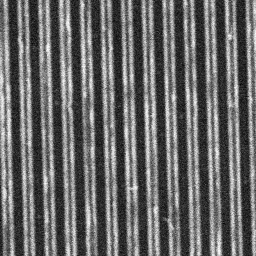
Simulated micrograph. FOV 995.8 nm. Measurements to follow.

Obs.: parallel lines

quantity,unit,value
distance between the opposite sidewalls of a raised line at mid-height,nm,39.9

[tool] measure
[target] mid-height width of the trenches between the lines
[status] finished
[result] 43.3 nanometres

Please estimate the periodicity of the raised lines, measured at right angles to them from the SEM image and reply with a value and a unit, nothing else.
80.8 nm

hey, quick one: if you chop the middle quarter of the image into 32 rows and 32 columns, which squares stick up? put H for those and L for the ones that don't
HHLLLHHLLLHHLLLHHLLLHHLLLHHLLLHH
HHLLLHHLLLHHLLLHHLLLHHLLLHHLLLHH
HHLLLHHLLLHHLLLHHLLLHHLLLHHHLLLH
HHLLLHHLLLHHLLLHHLLLHHLLLHHHLLLH
HHLLLHHLLLHHLLLHHLLLHHLLLHHHLLLH
HHLLLHHLLLHHLLLHHLLLHHLLLHHHLLLH
HHLLLHHLLLHHLLLHHLLLHHLLLHHHLLLH
HHLLLHHLLLHHLLLHHLLLHHHLLLHHLLLH
HHLLLHHLLLHHLLLHHLLLHHHLLLHHLLLH
HHLLLHHLLLHHLLLHHLLLHHHLLLHHLLLH
HHLLLHHLLLHHLLLHHLLLHHHLLLHHLLLH
HHLLLHHLLLHHLLLHHLLLHHHLLLHHLLLH
HHLLLHHLLLHHLLLHHHLLLHHLLLHHLLLH
HHLLLHHLLLHHLLLHHHLLLHHLLLHHLLLH
HHLLLHHLLLHHLLLHHHLLLHHLLLHHLLLH
HHLLLHHLLLHHLLLHHHLLLHHLLLHHLLLH
HHLLLHHLLLHHLLLHHHLLLHHLLLHHLLLH
HHLLLHHLLLHHLLLHHHLLLHHLLLHHLLLH
HHLLLHHLLLHHHLLHHHLLLHHLLLHHLLLH
HHLLLHHLLLHHHLLHHHLLLHHLLLHHLLLH
HHLLLHHLLLHHHLLHHHLLLHHLLLHHLLLH
HHLLLHHLLLHHHLLHHHLLLHHLLLHHLLLH
HHLLLHHLLLLHHLLHHHLLLHHLLLHHLLLH
HHLLLHHHLLLHHLLHHHLLLHHLLLHHLLLH
HHLLLHHHLLLHHLLHHHLLLHHLLLHHLLLH
HHLLLHHHLLLHHLLLHHLLLHHLLLHHLLLH
HHLLLHHHLLLHHLLLHHLLLHHLLLHHLLLH
HHLLLHHHLLLHHLLLHHLLLHHLLLHHLLLH
HHLLLHHHLLLHHLLLHHLLLHHLLLHHLLLH
HHHLLHHHLLLHHLLLHHLLLHHLLLHHLLLH
HHHLLHHHLLLHHLLLHHLLLHHLLLHHLLLH
HHHLLHHHLLLHHLLLHHLLLHHLLLHHLLLH